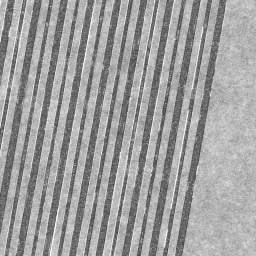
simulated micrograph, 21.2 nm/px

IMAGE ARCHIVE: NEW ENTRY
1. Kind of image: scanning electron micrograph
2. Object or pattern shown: parallel lines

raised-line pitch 274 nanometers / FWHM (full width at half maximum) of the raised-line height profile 151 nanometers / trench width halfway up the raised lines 151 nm